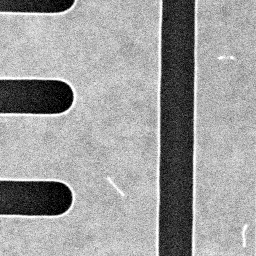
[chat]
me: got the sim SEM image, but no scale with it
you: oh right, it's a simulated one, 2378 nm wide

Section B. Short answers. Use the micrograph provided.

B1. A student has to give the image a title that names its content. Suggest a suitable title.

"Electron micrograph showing groups of lines, slits or small figures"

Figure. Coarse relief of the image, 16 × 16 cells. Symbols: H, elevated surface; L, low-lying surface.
LLLLHHHHHHLLHHHH
HHHHHHHHHHLLHHHH
HHHHHHHHHHLLHHHH
HHHHHHHHHHLLHHHH
HHHHHHHHHHLLHHHH
LLLLHHHHHHLLHHHH
LLLLHHHHHHLLHHHH
HHHHHHHHHHLLHHHH
HHHHHHHHHHLLHHHH
HHHHHHHHHHLLHHHH
HHHHHHHHHHLLHHHH
LLLLHHHHHHLLHHHH
LLLLLHHHHHLLHHHH
HHLHHHHHHHLLHHHH
HHHHHHHHHHLLHHHH
HHHHHHHHHHLLHHHH